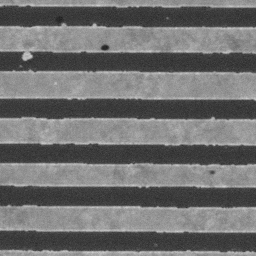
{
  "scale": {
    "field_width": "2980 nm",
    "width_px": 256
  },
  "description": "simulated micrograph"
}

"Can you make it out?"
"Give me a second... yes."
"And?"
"lines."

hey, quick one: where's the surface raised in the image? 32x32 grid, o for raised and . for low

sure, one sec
oooooooooooooooooooooooooooooooo
................................
................................
oooooooooooooooooooooooooooooooo
oooooooooooooooooooooooooooooooo
oooooooooooooooooooooooooooooooo
...o.....................oooo.oo
................................
................................
oooooooooooooooooooooooooooooooo
oooooooooooooooooooooooooooooooo
oooooooooooooooooooooooooooooooo
................................
................................
................................
oooooooooooooooooooooooooooooooo
oooooooooooooooooooooooooooooooo
oooooooooooooooooooooooooooooooo
................................
................................
ooooooooooo.....ooo.............
oooooooooooooooooooooooooooooooo
oooooooooooooooooooooooooooooooo
................................
................................
................................
oooooooooooooooooooooooooooooooo
oooooooooooooooooooooooooooooooo
oooooooooooooooooooooooooooooooo
................................
................................
oooooooooooooooooooooooooooooooo